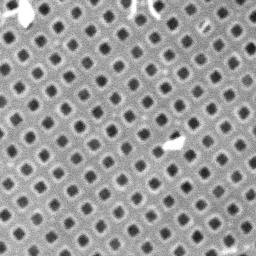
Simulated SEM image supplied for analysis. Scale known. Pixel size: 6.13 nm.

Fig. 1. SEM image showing a regular array of holes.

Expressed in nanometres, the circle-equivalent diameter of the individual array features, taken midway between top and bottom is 84.5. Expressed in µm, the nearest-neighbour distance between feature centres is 0.138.